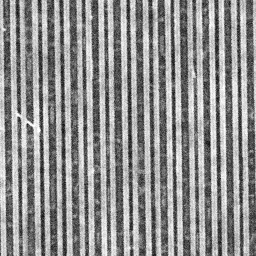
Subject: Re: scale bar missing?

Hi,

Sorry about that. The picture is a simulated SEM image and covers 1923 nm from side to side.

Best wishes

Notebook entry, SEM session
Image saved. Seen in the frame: parallel lines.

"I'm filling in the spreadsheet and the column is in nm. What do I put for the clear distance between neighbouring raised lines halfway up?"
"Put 60.1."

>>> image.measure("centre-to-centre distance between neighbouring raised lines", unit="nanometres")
82.4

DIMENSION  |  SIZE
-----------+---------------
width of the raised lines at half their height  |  33.8 nanometres